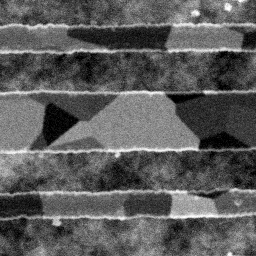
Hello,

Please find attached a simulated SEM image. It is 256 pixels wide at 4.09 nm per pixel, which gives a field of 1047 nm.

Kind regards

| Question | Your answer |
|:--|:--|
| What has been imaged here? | lines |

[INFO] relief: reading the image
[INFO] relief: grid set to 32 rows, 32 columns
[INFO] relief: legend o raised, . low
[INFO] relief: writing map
................................
................................
................................
oooooooooooooooooooooooooooooooo
oooooooooooooooooooooooooooooooo
oooooooooooooooooooooooooooooooo
ooo.ooooo.......................
................................
................................
................................
................................
...ooooo........ooo.....ooo.oooo
oooooooooooooooooooooooooooooooo
oooooooooooooooooooooooooooooooo
oooooooooooooooooooooooooooooooo
oooooooooooooooooooooooooooooooo
oooooooooooooooooooooooooooooooo
oooooooooooooooooooooooooooooooo
oooooooooooooooooooooooooooooooo
................................
................................
................................
................................
................................
oooooooooooooooooooooooooooooooo
oooooooooooooooooooooooooooooooo
oooooooooooooooooooooooooooooooo
................................
................................
................................
................................
................................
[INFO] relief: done